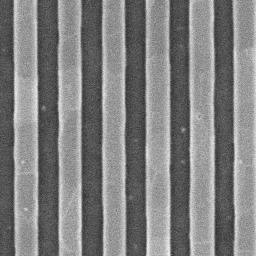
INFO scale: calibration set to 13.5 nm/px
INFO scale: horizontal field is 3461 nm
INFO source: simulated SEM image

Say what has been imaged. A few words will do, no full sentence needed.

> wiring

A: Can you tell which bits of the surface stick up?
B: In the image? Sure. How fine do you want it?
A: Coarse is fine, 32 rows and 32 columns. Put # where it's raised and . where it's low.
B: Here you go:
..###..###...###..###...###..###
..###..###...###..###...###..###
..###..###...###..###...###..###
..###..###...###..###...###..###
..###..###...###..###...###..###
..###..###...###..###...###..###
..###..###...###..###...###..###
..###..###...###..###...###..###
..###..###...###..###...###..###
..###..###...###..###...###..###
..###..###...###..###...###..###
..###..###...###..###...###..###
..###..###...###..###...###..###
..###..###...###..###...###..###
..###..###...###..###...###..###
..###..###...###..###...###..###
..###..###...###..###...###..###
..###..###...###..###...###..###
..###..###...###..###...###..###
..###..###...###..###...###..###
..###..###...###..###...###..###
..###..###...###..###...###..###
..###..###...###..###...###..###
..###..###...###..###...###..###
..###..###...###..###...###..###
..###..###...###..###...###..###
..###..###...###..###...###..###
..###..###...###..###...###..###
..###..###...###..###...###..###
..###..###...###..###...###..###
..###..###...###..###...###..###
..###..###...###..###...###..###